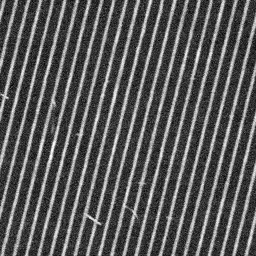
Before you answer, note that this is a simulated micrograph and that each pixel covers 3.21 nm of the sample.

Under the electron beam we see parallel lines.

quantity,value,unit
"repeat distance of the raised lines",0.0381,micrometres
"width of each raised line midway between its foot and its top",7.8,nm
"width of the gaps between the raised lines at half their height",0.0304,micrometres